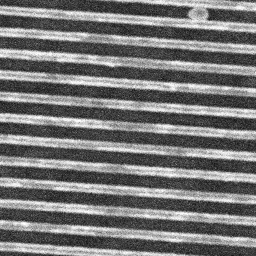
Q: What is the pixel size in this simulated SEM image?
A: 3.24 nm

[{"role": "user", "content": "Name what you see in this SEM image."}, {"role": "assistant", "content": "parallel lines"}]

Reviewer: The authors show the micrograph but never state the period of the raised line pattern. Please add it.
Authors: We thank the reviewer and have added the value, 21.4 px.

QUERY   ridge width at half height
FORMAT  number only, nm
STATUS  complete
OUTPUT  26.7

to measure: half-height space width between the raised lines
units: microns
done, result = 0.0444